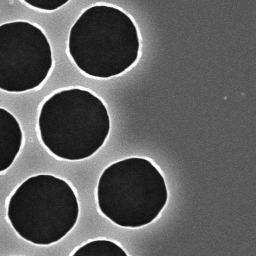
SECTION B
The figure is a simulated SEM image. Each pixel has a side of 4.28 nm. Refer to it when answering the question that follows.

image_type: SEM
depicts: holes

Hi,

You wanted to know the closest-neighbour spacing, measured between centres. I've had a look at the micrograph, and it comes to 380 nanometers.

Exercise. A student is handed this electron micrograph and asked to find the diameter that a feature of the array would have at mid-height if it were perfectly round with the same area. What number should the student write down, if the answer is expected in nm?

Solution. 300